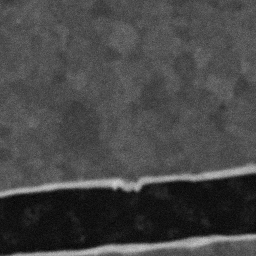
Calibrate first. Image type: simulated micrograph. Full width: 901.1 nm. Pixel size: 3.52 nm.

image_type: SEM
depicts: one or a few lines or trenches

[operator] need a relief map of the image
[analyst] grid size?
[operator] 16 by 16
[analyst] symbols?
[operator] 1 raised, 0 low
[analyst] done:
1111111111111111
1111111111111111
1111111111111111
1111111111111111
1111111111111111
1111111111111111
1111111111111111
1111111111111111
1111111111111111
1111111111111111
1111111111111111
1111100110000000
0000000000000000
0000000000000000
0000000000000000
0000000001111111